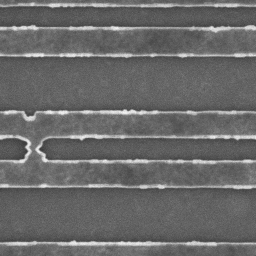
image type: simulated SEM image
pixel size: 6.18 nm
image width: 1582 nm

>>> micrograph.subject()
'one or a few lines or trenches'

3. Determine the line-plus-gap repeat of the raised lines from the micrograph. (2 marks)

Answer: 409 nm